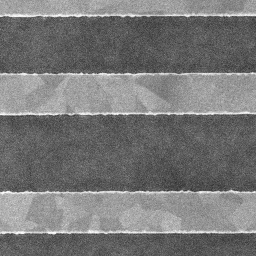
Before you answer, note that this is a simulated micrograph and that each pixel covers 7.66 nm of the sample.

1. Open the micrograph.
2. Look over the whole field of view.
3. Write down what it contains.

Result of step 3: lines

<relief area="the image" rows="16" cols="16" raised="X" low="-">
XXXXXXXXXXXXXXXX
----------------
----------------
----------------
----------------
XXXXXXXXXXXXXXXX
XXXXXXXXXXXXXXXX
----------------
----------------
----------------
----------------
----------------
XXXXXXXXXXXXXXXX
XXXXXXXXXXXXXXXX
XXXXXXXXXXXXXXXX
----------------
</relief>